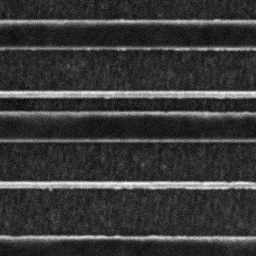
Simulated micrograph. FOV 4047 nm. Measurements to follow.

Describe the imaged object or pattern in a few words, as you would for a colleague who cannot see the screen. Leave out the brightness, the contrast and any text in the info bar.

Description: lines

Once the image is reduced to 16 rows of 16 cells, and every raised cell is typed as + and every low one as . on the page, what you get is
................
++++++++++++++++
++++++++++++++++
................
................
................
................
++++++++++++++++
++++++++++++++++
................
................
................
................
................
................
++++++++++++++++